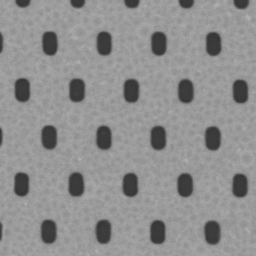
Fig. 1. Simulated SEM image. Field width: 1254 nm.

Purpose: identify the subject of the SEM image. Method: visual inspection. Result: a regular array of holes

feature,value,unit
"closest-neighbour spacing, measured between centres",266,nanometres